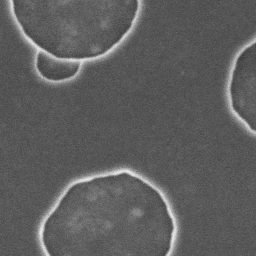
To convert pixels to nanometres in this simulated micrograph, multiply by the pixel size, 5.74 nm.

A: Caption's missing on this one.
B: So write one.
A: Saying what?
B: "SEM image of holes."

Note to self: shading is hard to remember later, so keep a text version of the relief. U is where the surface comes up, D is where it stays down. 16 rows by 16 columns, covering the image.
UDDDDDDDDUUUUUUU
UDDDDDDDUUUUUUUU
UUDDDDDUUUUUUUUU
UUUDDDUUUUUUUUUD
UUUUUUUUUUUUUUUD
UUUUUUUUUUUUUUDD
UUUUUUUUUUUUUUUD
UUUUUUUUUUUUUUUD
UUUUUUUUUUUUUUUU
UUUUUUUUUUUUUUUU
UUUUUUUUUUUUUUUU
UUUUUDDDDUUUUUUU
UUUUDDDDDDUUUUUU
UUUDDDDDDDDUUUUU
UUUDDDDDDDDUUUUU
UUUDDDDDDDDUUUUU